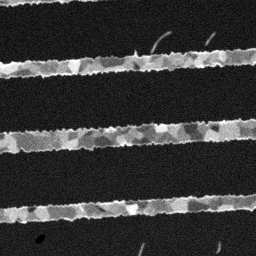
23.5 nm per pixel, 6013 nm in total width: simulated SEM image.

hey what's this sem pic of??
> one or a few lines or trenches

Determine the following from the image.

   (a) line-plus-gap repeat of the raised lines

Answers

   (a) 1700 nm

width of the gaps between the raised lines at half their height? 1.32 micrometres